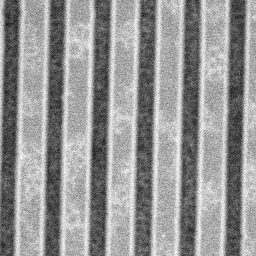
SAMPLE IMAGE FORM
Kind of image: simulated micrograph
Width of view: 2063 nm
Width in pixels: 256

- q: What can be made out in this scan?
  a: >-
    parallel lines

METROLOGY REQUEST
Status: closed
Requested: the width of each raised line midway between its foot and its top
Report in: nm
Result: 216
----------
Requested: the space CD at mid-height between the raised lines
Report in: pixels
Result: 18.7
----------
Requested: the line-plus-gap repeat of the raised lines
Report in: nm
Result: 364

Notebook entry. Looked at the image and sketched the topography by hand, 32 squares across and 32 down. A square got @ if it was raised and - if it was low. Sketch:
---@@@--@@@@--@@@---@@@--@@@@--@
---@@@--@@@@--@@@---@@@--@@@@--@
---@@@--@@@@--@@@---@@@--@@@@--@
---@@@--@@@@--@@@---@@@--@@@---@
---@@@--@@@@--@@@---@@@--@@@---@
---@@@--@@@@--@@@---@@@--@@@---@
---@@@--@@@@--@@@---@@@--@@@---@
---@@@--@@@@--@@@---@@@--@@@---@
---@@@--@@@---@@@---@@@--@@@---@
---@@@--@@@---@@@---@@@--@@@---@
--@@@@--@@@---@@@--@@@@--@@@---@
--@@@@--@@@---@@@--@@@@--@@@---@
--@@@@--@@@---@@@--@@@@--@@@---@
--@@@@--@@@---@@@--@@@@--@@@---@
--@@@@--@@@---@@@--@@@@--@@@---@
--@@@@--@@@---@@@--@@@@--@@@---@
--@@@@--@@@---@@@--@@@@--@@@---@
--@@@@--@@@---@@@--@@@---@@@---@
--@@@@--@@@---@@@--@@@---@@@---@
--@@@@--@@@---@@@--@@@---@@@--@@
--@@@@--@@@---@@@--@@@---@@@--@@
--@@@---@@@---@@@--@@@---@@@--@@
--@@@---@@@---@@@--@@@---@@@--@@
--@@@---@@@---@@@--@@@---@@@--@@
--@@@---@@@--@@@@--@@@---@@@--@@
--@@@@--@@@---@@@--@@@---@@@--@@
--@@@---@@@---@@@--@@@---@@@--@@
--@@@---@@@---@@@--@@@---@@@--@@
--@@@---@@@---@@@--@@@---@@@--@@
--@@@---@@@--@@@@--@@@---@@@--@@
--@@@---@@@--@@@@--@@@---@@@--@@
--@@@---@@@--@@@@--@@@---@@@--@@